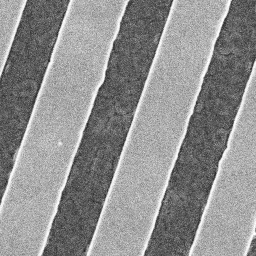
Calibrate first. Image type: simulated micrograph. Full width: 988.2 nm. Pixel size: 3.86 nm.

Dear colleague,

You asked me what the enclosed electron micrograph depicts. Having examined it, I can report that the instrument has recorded one or a few lines or trenches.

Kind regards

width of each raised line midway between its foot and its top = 208 nanometers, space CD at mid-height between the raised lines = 0.169 microns